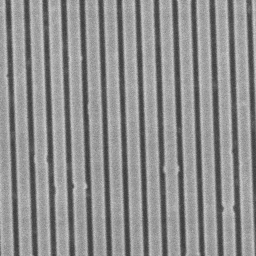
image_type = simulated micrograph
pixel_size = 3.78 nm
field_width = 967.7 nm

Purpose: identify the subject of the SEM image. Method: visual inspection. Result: parallel lines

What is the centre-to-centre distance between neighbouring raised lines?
18.5 px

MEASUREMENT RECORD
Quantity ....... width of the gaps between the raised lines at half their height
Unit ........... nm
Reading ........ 25.5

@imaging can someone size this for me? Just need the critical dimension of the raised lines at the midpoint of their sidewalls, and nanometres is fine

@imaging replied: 44.9